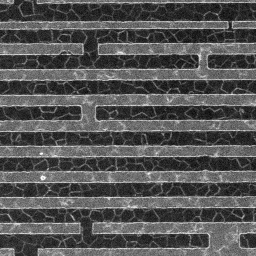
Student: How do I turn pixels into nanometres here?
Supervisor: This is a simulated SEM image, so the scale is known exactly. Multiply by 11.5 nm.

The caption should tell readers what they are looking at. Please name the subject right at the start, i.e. parallel lines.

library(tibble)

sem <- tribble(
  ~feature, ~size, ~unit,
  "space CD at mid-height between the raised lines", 0.121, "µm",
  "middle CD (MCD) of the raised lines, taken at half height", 0.172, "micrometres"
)